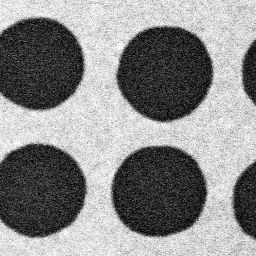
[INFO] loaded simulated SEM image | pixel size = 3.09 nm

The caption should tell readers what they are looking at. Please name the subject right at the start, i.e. holes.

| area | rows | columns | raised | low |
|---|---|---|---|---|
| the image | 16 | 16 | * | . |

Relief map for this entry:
****************
*...************
.....***.....***
.....***.....**.
.....**......**.
.....**......**.
*...****....****
*********..*****
****************
*...****....****
.....**.....***.
.....**......**.
.....**......**.
.....**.....***.
*...****...****.
****************